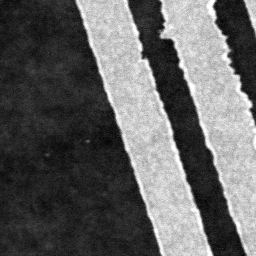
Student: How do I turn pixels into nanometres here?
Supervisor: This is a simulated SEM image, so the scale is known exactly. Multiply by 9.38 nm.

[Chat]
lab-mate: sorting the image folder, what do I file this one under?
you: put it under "one or a few lines or trenches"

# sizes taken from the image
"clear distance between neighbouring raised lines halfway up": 315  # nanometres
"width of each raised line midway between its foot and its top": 430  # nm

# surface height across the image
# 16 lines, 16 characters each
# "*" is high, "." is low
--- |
.....***..***...
.....***..****..
......***..***..
......***..***..
......***...***.
.......***..***.
.......***..****
.......***...***
........***..***
........***..***
........***...**
.........***..**
.........***..**
.........***...*
..........***..*
..........***..*